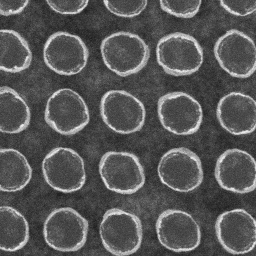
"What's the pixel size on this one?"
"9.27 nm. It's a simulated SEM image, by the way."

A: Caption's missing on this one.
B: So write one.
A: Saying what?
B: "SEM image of a regular array of raised bodies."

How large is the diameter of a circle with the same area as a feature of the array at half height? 42 pixels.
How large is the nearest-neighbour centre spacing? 521 nanometers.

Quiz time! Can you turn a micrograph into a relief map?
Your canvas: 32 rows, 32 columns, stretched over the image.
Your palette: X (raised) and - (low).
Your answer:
XXX---XXXXX--XXXXX--XXXXX---XXXX
XX-----XXX----XXXX---XXX-----XX-
--------------------------------
--------------------------------
XX-----XX-----XXX----XX-----XXX-
XXX---XXXX---XXXXX--XXXXX--XXXXX
XXXX--XXXXX--XXXXX--XXXXX--XXXXX
XXXX--XXXXX--XXXXX--XXXXX--XXXXX
XXX---XXXX----XXX----XXXX---XXXX
--------------------------------
--------------------------------
XX-----XX-----X-----------------
XXX---XXXX---XXXX---XXXX----XXXX
XXX---XXXXX--XXXXX--XXXXX--XXXXX
XXXX--XXXXX--XXXXX--XXXXX--XXXXX
XXX---XXXXX--XXXXX--XXXXX---XXXX
-X------X------X------XX-----XX-
--------------------------------
--------------------------------
XXX---XXXX---XXXX----XXX----XXX-
XXXX-XXXXX---XXXX---XXXXX--XXXXX
XXXX--XXXXX--XXXXX--XXXXX--XXXXX
XXXX--XXXXX--XXXXX--XXXXX--XXXXX
XXX----XXX----XXX----XXX----XXXX
--------------------------------
--------------------------------
XX-----XX-----X-------X-----XX--
XXX---XXXX---XXXX---XXXX---XXXXX
XXXX--XXXXX--XXXX---XXXXX--XXXXX
XXX---XXXXX--XXXX---XXXXX--XXXXX
XXX---XXXX---XXXX---XXXXX---XXXX
--------------XX-------------XX-